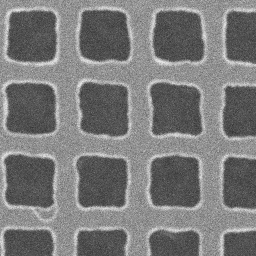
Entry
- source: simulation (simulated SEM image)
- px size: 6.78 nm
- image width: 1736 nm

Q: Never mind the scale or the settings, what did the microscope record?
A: a regular array of holes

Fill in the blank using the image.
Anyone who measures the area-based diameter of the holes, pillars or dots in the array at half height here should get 385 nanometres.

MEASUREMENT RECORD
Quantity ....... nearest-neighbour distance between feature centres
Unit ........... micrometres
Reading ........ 0.489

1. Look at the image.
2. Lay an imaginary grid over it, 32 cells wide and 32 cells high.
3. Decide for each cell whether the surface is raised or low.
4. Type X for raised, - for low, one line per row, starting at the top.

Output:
XXXXXXXXXXXXXXXXXXXXXXXXXXXXXXXX
XX-----XXX-----XXXXX----XXXXX---
X------XXX------XXX------XXX----
X------XXX------XXX------XXX----
X------XXX------XXX-------XX----
X------XXX------XXX-------XX----
X------XXX------XXX-------XX----
X------XXXX-----XXXX-----XXXX---
XXXXXXXXXXXXXXXXXXXXXXXXXXXXXXXX
XXXXXXXXXXXXXXXXXXXXXXXXXXXXXXXX
X-----XXXX----XXXXX---XXXXXXXXXX
X------XXX------XXX------XXX----
X------XXX------XXX------XXX----
X------XXX------XXX------XXX----
X------XXX------XXX------XXX----
X------XXX------XXX------XXX----
X------XXX------XXX------XXX----
XXXXXXXXXXXXXXXXXXXXXXXXXXXXXXXX
XXXXXXXXXXXXXXXXXXXXXXXXXXXXXXXX
X---X-XXXX---XXXXXXXX--XXXXXXXXX
-------XX-------XXX------XXX----
X------XXX------XXX------XXX----
X------XXX------XXX------XXX----
X------XXX------XXX------XXX----
X------XXX------XXX------XXX----
X------XXX------XXX------XXX----
XXXXXXXXXXXXXXXXXXXXXXXXXXXXXXXX
XXXXXXXXXXXXXXXXXXXXXXXXXXXXXXXX
X-XXXXXXXXXXXXXXXXXXXXXXXXXXXXXX
-------XXX------XXX------XXX----
-------XXX------XXX------XXX----
-------XX-------XXX------XXX----